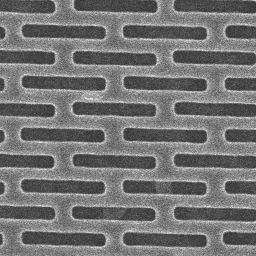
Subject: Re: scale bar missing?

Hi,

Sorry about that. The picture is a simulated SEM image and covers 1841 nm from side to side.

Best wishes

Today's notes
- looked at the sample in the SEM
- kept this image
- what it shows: a regular array of holes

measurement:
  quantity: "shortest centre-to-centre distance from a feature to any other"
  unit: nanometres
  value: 372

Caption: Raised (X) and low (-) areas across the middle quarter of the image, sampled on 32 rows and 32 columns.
XXXXXXXXXXXXX----------XXXXXXXXX
XXXXXXXXXXXXXXXXXXXXXXXXXXXXXXXX
XXXXXXXXXXXXXXXXXXXXXXXXXXXXXXXX
---------XXXXXX-----------------
-----------XXXX-----------------
----------XXXXX-----------------
----------XXXXXXX---------------
XXXXXXXXXXXXXXXXXXXXXXXXXXXXXXXX
XXXXXXXXXXXXXXXXXXXXXXXXXXXXXXXX
XXX-------XXXXXXXXXXXXXXXXXX----
XX---------------------XXXXX----
XX---------------------XXXX-----
XXX--------------------XXXXX----
XXXXXXXXXXXXXXXXXXXXXXXXXXXXXXXX
XXXXXXXXXXXXXXXXXXXXXXXXXXXXXXXX
XXXXXXXXXXXXXXXXXXXXXXXXXXXXXXXX
---------XXXXXX-----------------
----------XXXXX-----------------
----------XXXXX-----------------
---XX----XXXXXXX----------------
XXXXXXXXXXXXXXXXXXXXXXXXXXXXXXXX
XXXXXXXXXXXXXXXXXXXXXXXXXXXXXXXX
XXX---XXXXXXXXXXXXXXXXXXXXXX----
XX---------------------XXXX-----
XX---------------------XXXX-----
XXX--------------------XXXXX----
XXXXXXXXXXXXXXXXXXXXX-XXXXXXXXXX
XXXXXXXXXXXXXXXXXXXXXXXXXXXXXXXX
XXXXXXXXXXXXXXXXXXXXXXXXXXXXXXXX
----------XXXXX-----------------
----------XXXXX-----------------
----------XXXXX-----------------